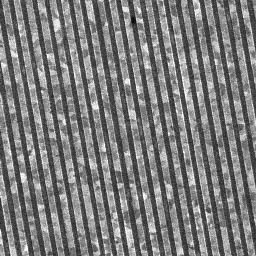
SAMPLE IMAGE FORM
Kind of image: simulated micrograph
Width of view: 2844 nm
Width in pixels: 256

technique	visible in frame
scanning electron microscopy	parallel lines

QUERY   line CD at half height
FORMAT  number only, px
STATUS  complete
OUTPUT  5.66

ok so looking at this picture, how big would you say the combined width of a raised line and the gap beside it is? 130 nm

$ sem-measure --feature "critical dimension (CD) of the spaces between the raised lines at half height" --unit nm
62.9